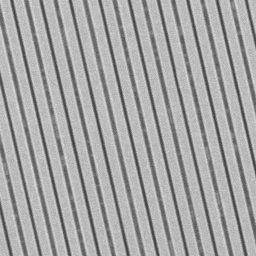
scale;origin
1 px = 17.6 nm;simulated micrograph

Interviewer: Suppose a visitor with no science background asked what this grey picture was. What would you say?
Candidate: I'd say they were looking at parallel lines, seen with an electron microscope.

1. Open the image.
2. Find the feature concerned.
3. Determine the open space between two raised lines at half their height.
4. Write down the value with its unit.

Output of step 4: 73.9 nanometres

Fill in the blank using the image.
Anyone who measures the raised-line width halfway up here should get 167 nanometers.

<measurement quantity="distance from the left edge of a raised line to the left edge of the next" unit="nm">251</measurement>